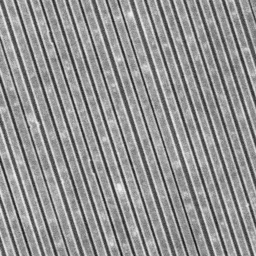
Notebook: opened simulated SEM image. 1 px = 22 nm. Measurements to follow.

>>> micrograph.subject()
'parallel lines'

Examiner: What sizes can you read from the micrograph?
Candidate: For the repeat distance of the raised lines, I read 274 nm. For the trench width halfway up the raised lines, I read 96.9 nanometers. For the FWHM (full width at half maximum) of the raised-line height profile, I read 178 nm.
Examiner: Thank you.